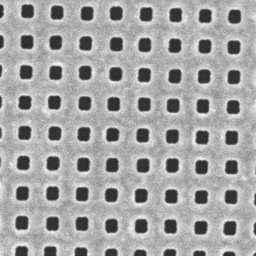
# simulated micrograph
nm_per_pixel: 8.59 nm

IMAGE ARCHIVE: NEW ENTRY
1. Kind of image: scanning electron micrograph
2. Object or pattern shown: a regular array of holes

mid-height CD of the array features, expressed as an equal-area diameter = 128 nm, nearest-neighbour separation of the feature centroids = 0.252 µm